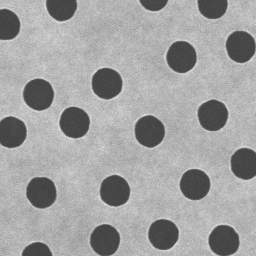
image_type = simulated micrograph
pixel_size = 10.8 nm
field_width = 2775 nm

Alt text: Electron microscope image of a regular array of holes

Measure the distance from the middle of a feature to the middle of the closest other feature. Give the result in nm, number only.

668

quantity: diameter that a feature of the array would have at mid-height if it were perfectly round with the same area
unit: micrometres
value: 0.339